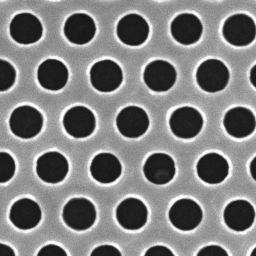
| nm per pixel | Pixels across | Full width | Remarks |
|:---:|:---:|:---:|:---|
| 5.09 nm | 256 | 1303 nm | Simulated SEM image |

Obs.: a regular array of holes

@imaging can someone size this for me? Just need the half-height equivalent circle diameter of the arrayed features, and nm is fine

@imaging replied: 161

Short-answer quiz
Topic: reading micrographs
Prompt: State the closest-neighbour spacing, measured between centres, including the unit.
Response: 268 nanometres